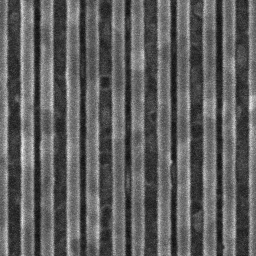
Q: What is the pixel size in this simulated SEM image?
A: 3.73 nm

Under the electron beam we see parallel lines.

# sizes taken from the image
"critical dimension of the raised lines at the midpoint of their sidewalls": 0.0434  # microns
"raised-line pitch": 22.4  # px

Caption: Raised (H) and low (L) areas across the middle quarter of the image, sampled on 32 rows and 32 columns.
LHHHLLHHLLLLHHHLLHHHLLLLHHLLHHHL
LHHHLLHHHLLLHHHLLHHHLLLLHHLLHHHL
LHHHLLHHHLLLHHHLLHHHLLLLHHLLHHHL
LHHHLLHHHLLLHHHLLHHHLLLLHHLLHHHL
LHHHLLHHHLLLHHHLLHHHLLLLHHLLHHHL
LHHHLLHHHLLLHHHLLHHHLLLLHHLLHHHL
LHHHLLHHHLLLHHHLLHHHLLLLHHLLHHHL
LHHHLLHHHLLLHHHLLHHHLLLLHHLLHHHL
LHHHLLHHHLLLHHHLLHHHLLLLHHLLHHHL
LHHHLLHHHLLLHHHLLHHHLLLLHHHLHHHL
LHHHLLHHHLLLHHHLLHHHLLLLHHHLHHHL
LHHHLLHHLLLLHHHLLHHHLLLLHHHLHHHL
LHHHLLHHLLLLHHHLLHHHLLLLHHHLHHHL
LHHHLLHHLLLLHHHLLHHHLLLLHHHLHHHL
LHHHLLHHLLLLHHHLLHHHLLLLHHHLHHHL
LHHHLLHHHLLLHHHLLHHHLLLLHHLLHHHL
LHHHLLHHHLLLHHHLLHHHLLLLHHLLHHHL
LHHHLLHHLLLLHHHLLHHHLLLLHHLLHHHL
LHHHLLHHLLLLHHHLLHHHLLLLHHLLHHHL
LHHHLLHHLLLLHHHLLHHHLLLLHHHLHHHL
LHHHLLHHHLLLHHHLLHHHLLLLHHLLHHHL
LHHHLLHHLLLLHHHLLHHHLLLLHHLLLHHL
LHHHLLHHLLLLHHHLLHHHLLLLHHLLLHHL
LHHHLLHHLLLLHHHLLHHHLLLLHHLLLHHL
LHHHLLHHLLLLHHHLLHHHLLLLHHHLLHHL
LHHHLLHHHLLLHHHLLHHHLLLLHHHLLHHL
LHHHLLHHHLLLHHHLLHHHLLLLHHLLLHHL
LHHHLLHHHLLLHHHLLHHHLLLLHHLLLHHL
LHHHLLHHLLLLHHHLLHHHLLLLHHLLLHHL
LHHHLLHHLLLLHHHLLHHHLLLLHHHLLHHL
LHHHLLHHHLLLHHHLLHHHLLLLHHHLLHHL
LHHHLLHHHLLLHHHLLHHHLLLLHHHLLHHL